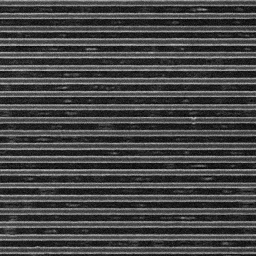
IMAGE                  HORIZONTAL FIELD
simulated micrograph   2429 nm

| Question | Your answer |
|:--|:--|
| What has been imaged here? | parallel lines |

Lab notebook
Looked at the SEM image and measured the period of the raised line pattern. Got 0.123 micrometres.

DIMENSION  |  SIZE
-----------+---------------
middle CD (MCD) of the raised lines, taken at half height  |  51 nm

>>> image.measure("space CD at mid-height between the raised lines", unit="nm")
68.8